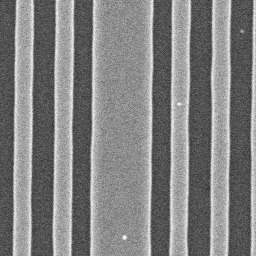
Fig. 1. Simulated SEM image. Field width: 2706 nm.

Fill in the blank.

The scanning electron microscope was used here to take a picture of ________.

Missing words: groups of lines, slits or small figures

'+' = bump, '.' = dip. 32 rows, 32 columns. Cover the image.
..++...++...+++++++...++...++...
..++...++...+++++++...++...++...
..++...++...+++++++...++...++...
..++...++...+++++++...++...++...
..++...++...+++++++...++...++...
..++...++...+++++++...++...++...
..++...++...+++++++...++...++...
..++...++...+++++++...++...++...
..++...++...+++++++...++...++...
..++...++...+++++++...++...++...
..++...++...+++++++...++...++...
..++...++...+++++++...++...++...
..++...++...+++++++...++...++...
..++...++...+++++++...+....++...
..++...++...+++++++...+....++...
..++...++...+++++++...+....++...
..++...++...+++++++...+....++..+
..++...++..++++++++...+....++..+
..++...++..++++++++...+....++...
..++...++..++++++++...+....++...
..++...++..++++++++...+....++...
..++...++..++++++++..++....++...
..++...++..++++++++..++....+....
..++...++..++++++++..++...++....
..++...++..++++++++..++...++....
..++...++..++++++++..++...++....
..++...++..++++++++..++....+....
..++...++..++++++++..++....+....
..++...++..++++++++..++...++....
..++...++..++++++++..++...++....
..++...++..++++++++..++...++....
..++...++..++++++++..++...++....